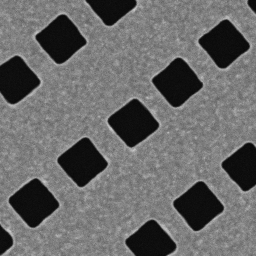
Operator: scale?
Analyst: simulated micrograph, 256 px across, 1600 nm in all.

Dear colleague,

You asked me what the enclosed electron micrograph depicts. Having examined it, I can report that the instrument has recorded holes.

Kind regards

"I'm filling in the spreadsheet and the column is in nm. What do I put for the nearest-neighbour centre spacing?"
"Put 397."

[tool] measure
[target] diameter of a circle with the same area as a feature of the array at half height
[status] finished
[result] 272 nanometers